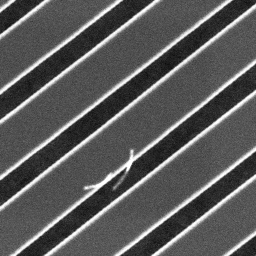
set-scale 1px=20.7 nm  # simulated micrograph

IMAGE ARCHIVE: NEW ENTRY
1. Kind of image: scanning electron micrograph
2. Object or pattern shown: lines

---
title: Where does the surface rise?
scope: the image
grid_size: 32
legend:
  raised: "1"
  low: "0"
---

10000111111111100001111111110000
00001111111110000011111111100001
00111111111100001111111111000111
01111111111000011111111110001111
11111111100000111111111000011111
11111111000011111111110000111111
11111110000111111111100011111111
11111000001111111110000111111111
11110000111111111100001111111110
11100001111111111000011111111100
11000011111111100001111111111000
00000111111111000011111111100000
00011111111110000111111111000011
00111111111100001111111110000111
01111111110000111111111100001111
11111111100001111111110000011111
11111111000011111111100001111111
11111100000111111111000011111111
11111000011111111110000111111111
11110000111111111000011111111110
11100001111111110000111111111100
10000111111111100001111111111000
00001111111111000011111111100001
00011111111100001111111111000011
00111111111000011111111110000111
01111111110000111111111000011111
11111111100001111111110000111111
11111110000111111111100001111111
11111100001111111110000111111111
11111000011111111100001111111111
11110001111111111000011111111100
11000011111111110000111111111000